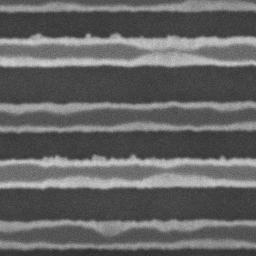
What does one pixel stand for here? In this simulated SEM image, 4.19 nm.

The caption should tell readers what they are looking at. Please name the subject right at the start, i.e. lines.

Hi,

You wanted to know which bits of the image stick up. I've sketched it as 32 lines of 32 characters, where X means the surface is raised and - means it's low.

XXXXXXXXXXXXXXXXXXXXXXXXXXXXXXXX
--------------------------------
--------------------------------
--------------------------------
--------------------------------
XXXXXXXXXXXXXXXXXXXXXXXXXXXXXXXX
XXXXXXXXXXXXXXXXXXXXXXXXXXXXXXXX
XXXXXXXXXXXXXXXXXXXXXXXXXXXXXXXX
--------------------------------
--------------------------------
--------------------------------
--------------------------------
--------------------------------
XXXXXXXXXXXXXXXXXXXXXXXXXXXXXXXX
XXXXXXXXXXXXXXXXXXXXXXXXXXXXXXXX
XXXXXXXXXXXXXXXXXXXXXXXXXXXXXXXX
--------------------------------
--------------------------------
--------------------------------
--------------------------------
XXXXXXXXXXXXXXXXXXXXXXXXXXXXXXXX
XXXXXXXXXXXXXXXXXXXXXXXXXXXXXXXX
XXXXXXXXXXXXXXXXXXXXXXXXXXXXXXXX
--------------------------------
--------------------------------
--------------------------------
--------------------------------
--------------------------------
XXXXXXXXXXXXXXXXXXXXXXXXXXXXXXXX
XXXXXXXXXXXXXXXXXXXXXXXXXXXXXXXX
XXXXXXXXXXXXXXXXXXXXXXXXXXXXXXXX
--------------------------------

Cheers